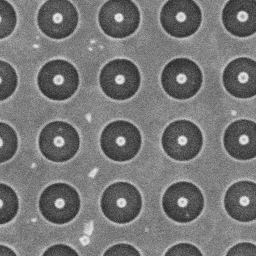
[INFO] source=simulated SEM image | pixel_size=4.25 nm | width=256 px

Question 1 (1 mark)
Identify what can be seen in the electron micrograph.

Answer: an array of small figures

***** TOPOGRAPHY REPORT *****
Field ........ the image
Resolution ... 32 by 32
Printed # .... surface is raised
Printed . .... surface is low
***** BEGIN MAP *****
.####....####....####....###....
..###.....##.....###.....###....
..###.....##......##.....###....
..###.....###....###.....###....
.#####...#####..#####...#####..#
################################
################################
######..######..######..#####...
..###....####....###.....###....
..###.....##......##.....###..#.
..###.....##......##.....###....
..###....####....####....####...
.######.######..################
################################
################################
.#####...####....####...#####...
..###.....###.....##.....###....
..###..#..##......##.....###..#.
..###.....###.....##.....###....
..###....####....####....####...
################################
################################
################################
..####...####....####....####...
..###.....###.....##.....###....
..###..#..###.....##......##....
..###.....###.....###....###....
.#####...#####...####...#####...
################################
################################
###############.######..######..
..####....###....####....###....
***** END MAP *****